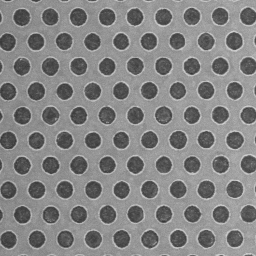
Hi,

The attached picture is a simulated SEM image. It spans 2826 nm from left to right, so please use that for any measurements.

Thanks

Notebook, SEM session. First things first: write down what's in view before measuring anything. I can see a regular array of holes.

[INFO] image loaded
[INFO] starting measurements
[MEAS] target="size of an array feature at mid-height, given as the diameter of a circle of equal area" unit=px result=17.9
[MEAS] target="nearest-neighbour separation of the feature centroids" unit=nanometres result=308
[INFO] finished